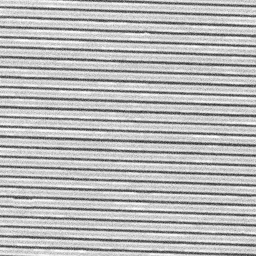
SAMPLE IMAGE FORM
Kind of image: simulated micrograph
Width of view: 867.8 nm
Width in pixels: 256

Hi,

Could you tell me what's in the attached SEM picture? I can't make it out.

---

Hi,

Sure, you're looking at parallel lines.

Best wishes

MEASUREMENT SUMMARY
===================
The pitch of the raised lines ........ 0.0338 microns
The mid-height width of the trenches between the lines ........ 11.9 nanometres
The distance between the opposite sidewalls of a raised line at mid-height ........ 20.8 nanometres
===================